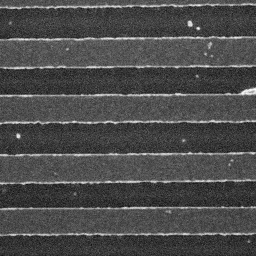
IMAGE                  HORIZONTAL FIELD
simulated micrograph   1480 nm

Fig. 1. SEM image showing lines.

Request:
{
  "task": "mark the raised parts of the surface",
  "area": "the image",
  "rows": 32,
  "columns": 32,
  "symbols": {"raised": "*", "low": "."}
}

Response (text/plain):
********************************
................................
................................
................................
................................
********************************
********************************
********************************
*****...........................
................................
................................
................................
********************************
********************************
********************************
................................
................................
................................
................................
********************************
********************************
********************************
********************************
................................
................................
................................
********************************
********************************
********************************
................................
................................
................................